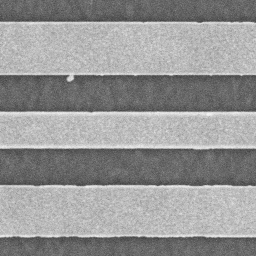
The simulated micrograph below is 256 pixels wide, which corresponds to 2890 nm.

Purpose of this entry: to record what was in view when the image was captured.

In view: lines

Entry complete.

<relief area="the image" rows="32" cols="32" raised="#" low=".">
................................
................................
................................
################################
################################
################################
################################
################################
################################
................................
................................
................................
................................
................................
################################
################################
################################
################################
................................
................................
................................
................................
................................
################################
################################
################################
################################
################################
################################
########.######...######.#######
................................
................................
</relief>